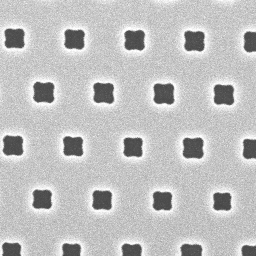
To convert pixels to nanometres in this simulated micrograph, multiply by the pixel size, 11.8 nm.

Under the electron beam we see a regular array of holes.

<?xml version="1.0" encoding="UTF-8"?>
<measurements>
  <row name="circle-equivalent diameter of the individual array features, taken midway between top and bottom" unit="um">0.267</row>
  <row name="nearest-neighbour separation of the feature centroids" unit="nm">710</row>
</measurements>